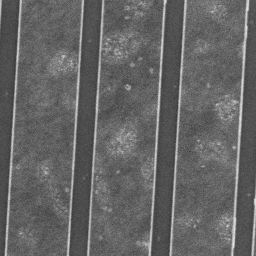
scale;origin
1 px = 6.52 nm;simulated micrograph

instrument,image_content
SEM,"one or a few lines or trenches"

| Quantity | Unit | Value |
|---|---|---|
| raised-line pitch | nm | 535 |